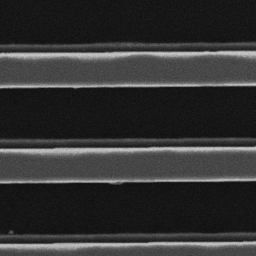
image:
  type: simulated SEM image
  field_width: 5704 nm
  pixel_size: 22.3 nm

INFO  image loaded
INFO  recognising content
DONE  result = lines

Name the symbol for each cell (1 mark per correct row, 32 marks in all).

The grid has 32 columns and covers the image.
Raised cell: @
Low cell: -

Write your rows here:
--------------------------------
--------------------------------
--------------------------------
--------------------------------
--------------------------------
--------------------------------
@@@@@@@@@@@@@@@@@@@@@@@@@@@@@@@@
@@@@@@@@@@@@@@@@@@@@@@@@@@@@@@@@
@@@@@@@@@@@@@@@@@@@@@@@@@@@@@@@@
@@@@@@@@@@@@@@@@@@@@@@@@@@@@@@@@
@@@@@@@@@@@@@@@@@@@@@@@@@@@@@@@@
--------------------------------
--------------------------------
--------------------------------
--------------------------------
--------------------------------
--------------------------------
--------------------------------
@@@@@@@@@@@@@@@@@@@@@@@@@@@@@@@@
@@@@@@@@@@@@@@@@@@@@@@@@@@@@@@@@
@@@@@@@@@@@@@@@@@@@@@@@@@@@@@@@@
@@@@@@@@@@@@@@@@@@@@@@@@@@@@@@@@
@@@@@@@@@@@@@@@@@@@@@@@@@@@@@@@@
--------------------------------
--------------------------------
--------------------------------
--------------------------------
--------------------------------
--------------------------------
-------------------@--@@@@@@@@@@
@@@@@@@@@@@@@@@@@@@@@@@@@@@@@@@@
@@@@@@@@@@@@@@@@@@@@@@@@@@@@@@@@